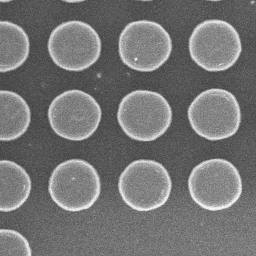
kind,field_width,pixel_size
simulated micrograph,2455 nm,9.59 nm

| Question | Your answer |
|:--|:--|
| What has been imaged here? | a regular array of raised bodies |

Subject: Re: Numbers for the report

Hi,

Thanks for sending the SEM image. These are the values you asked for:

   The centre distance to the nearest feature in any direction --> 0.667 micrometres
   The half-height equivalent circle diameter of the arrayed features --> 0.49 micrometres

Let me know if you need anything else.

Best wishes